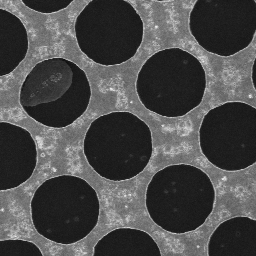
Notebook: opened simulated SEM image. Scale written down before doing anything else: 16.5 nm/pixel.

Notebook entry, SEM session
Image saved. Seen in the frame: holes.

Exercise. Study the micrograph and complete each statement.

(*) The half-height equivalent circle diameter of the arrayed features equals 69.1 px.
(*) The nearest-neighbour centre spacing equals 1350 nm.